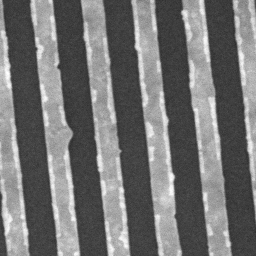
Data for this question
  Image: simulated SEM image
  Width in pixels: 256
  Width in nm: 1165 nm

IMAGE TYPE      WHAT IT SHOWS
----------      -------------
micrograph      parallel lines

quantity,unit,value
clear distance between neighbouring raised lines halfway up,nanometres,128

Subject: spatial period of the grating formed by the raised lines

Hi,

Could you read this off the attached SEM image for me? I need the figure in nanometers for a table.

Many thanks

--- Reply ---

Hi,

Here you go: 228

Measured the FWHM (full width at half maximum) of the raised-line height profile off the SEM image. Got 99 nanometers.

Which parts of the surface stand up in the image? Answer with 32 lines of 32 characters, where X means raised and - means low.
----XXX---XXX---XXX----XXX---XXX
----XXX---XXX----XX----XXX---XXX
X---XXX---XXX----XX----XXX---XXX
X---XXX---XXX----XXX---XXX---XXX
X---XXX---XXX----XXX---XXX---XXX
X---XXX----XX----XXX---XXX----XX
X----XX----XXX---XXX---XXX----XX
X----XX----XXX---XXX---XXX----XX
X----XX----XXX---XXX----XX----XX
X----XXX---XXX---XXX----XX----XX
X----XXX---XXX----XX----XXX---XX
XX---XXX---XXX----XX----XXX---XX
XX---XXX---XXX----XXX---XXX---XX
XX---XXX----XX----XXX---XXX----X
XX---XXX----XX----XXX---XXX----X
XX----XX----XXX---XXX---XXX----X
XX----XXX---XXX---XXX----XX----X
XX----XXX---XXX---XXX----XXX---X
XX----XXX---XXX---XXX----XXX---X
XX----XXX---XXX----XX----XXX---X
XX----XXX---XXX----XX----XXX---X
XXX---XXX---XXX----XXX---XXX---X
XXX---XXX----XX----XXX---XXX---X
XXX---XXX----XX----XXX---XXX----
XXX---XXX----XXX---XXX---XXX----
XXX----XX----XXX---XXX----XX----
XXX----XX----XXX---XXX----XX----
XXX----XX----XXX---XXX----XX----
-XX----XXX---XXX---XXX----XXX---
-XX----XXX---XXX----XX----XXX---
-XXX---XXX---XXX----XX----XXX---
-XXX---XXX---XXX----XXX---XXX---